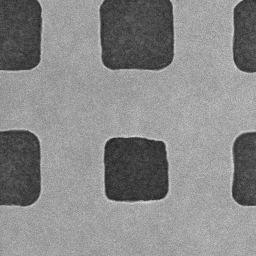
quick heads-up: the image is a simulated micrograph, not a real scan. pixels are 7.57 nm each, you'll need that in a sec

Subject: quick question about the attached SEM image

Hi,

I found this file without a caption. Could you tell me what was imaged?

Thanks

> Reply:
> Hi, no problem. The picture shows holes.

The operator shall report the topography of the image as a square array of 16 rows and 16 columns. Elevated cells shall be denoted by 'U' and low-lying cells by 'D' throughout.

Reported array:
DDDUUUDDDDDUUUUD
DDDUUUDDDDDUUUUD
DDDUUUDDDDDUUUUD
DDDUUUDDDDDUUUUD
UUUUUUUUUUUUUUUD
UUUUUUUUUUUUUUUU
UUUUUUUUUUUUUUUU
UUUUUUUUUUUUUUUU
DDUUUUUUUUUUUUUD
DDDUUUUDDDUUUUUD
DDDUUUUDDDDUUUUD
DDDUUUUDDDDUUUUD
DDUUUUUDDDUUUUUD
UUUUUUUUUUUUUUUU
UUUUUUUUUUUUUUUU
UUUUUUUUUUUUUUUU